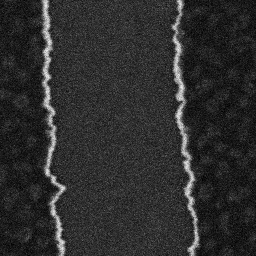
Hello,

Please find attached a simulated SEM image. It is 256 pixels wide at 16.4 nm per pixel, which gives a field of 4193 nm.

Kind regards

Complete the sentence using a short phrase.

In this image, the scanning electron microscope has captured one or a few lines or trenches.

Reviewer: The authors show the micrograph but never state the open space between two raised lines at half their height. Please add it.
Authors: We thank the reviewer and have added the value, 2160 nanometres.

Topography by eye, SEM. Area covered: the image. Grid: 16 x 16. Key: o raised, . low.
ooo........ooooo
ooo........ooooo
ooo........ooooo
ooo........ooooo
ooo........ooooo
ooo........ooooo
ooo........ooooo
ooo........ooooo
ooo........ooooo
ooo.........oooo
ooo.........oooo
oooo........oooo
ooo.........oooo
ooo.........oooo
oooo........oooo
oooo........oooo